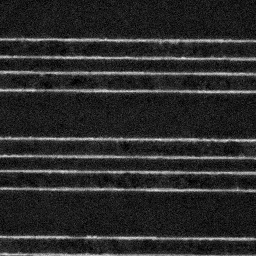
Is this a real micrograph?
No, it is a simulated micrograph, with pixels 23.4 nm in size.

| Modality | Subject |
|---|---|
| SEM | lines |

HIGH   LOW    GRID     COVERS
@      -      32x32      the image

--------------------------------
--------------------------------
--------------------------------
--------------------------------
--------------------------------
@@@@@@@@@@@@@@@@@@@@@@@@@@@@@@@@
@@@@@@@@@@@@@@@@@@@@@@@@@@@@@@@@
--------------------------------
--------------------------------
@@@@@@@@@@@@@@@@@@@@@@@@@@@@@@@@
@@@@@@@@@@@@@@@@@@@@@@@@@@@@@@@@
--------------------------------
--------------------------------
--------------------------------
--------------------------------
--------------------------------
--------------------------------
@@@@@@@@@@@@@@@@@@@@------------
@@@@@@@@@@@@@@@@@@@@@@@@@@@@@@@@
--@@@@@@@@@@@@@@@@@@@@@@@@@@@@@@
--------------------------------
@@@@@@@@@@@@@@@-----------------
@@@@@@@@@@@@@@@@@@@@@@@@@@@@@@@@
@@@@@@@@@@@@@@@@@@@@@@@@@@@@@@@@
--------------------------------
--------------------------------
--------------------------------
--------------------------------
--------------------------------
--------------------------------
@@@@@@@@@@@@@@@@@@@@@@@@@@@@@@@@
@@@@@@@@@@@@@@@@@@@@@@@@@@@@@@@@